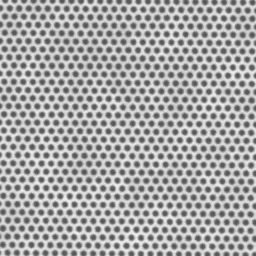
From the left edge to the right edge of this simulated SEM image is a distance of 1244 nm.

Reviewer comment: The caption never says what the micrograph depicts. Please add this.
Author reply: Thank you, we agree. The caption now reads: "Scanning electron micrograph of a regular array of holes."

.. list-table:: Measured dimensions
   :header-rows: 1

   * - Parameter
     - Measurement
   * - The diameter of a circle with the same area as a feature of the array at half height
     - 31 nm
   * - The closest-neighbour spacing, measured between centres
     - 44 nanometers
